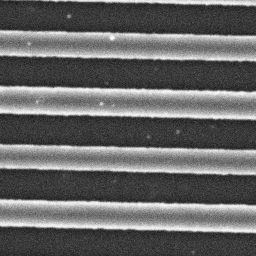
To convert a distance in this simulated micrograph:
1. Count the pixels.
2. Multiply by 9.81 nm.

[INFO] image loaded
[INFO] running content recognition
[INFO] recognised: lines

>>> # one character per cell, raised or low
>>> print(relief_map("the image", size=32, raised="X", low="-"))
-------------------------X-XXXXX
--------------------------------
--------------------------------
--------------------------------
XXXXXXXXXXXXXXXXXXXXXXXXXXXX----
XXXXXXXXXXXXXXXXXXXXXXXXXXXXXXXX
XXXXXXXXXXXXXXXXXXXXXXXXXXXXXXXX
----------------------------X-XX
--------------------------------
--------------------------------
--------------------------------
XXXXXXXXXXXXXXXXXXXXXXXXXXXXXXX-
XXXXXXXXXXXXXXXXXXXXXXXXXXXXXXXX
XXXXXXXXXXXXXXXXXXXXXXXXXXXXXXXX
----------------XXXXXXXXXXXXXXXX
--------------------------------
--------------------------------
--------------------------------
XXXXXXXXXXXXXXX-----------------
XXXXXXXXXXXXXXXXXXXXXXXXXXXXXXXX
XXXXXXXXXXXXXXXXXXXXXXXXXXXXXXXX
--------------------XXXXXXXXXXXX
--------------------------------
--------------------------------
--------------------------------
XXXXXXXXXXXXXXXXXXXXXX----------
XXXXXXXXXXXXXXXXXXXXXXXXXXXXXXXX
XXXXXXXXXXXXXXXXXXXXXXXXXXXXXXXX
-------------XXXXXXXXXXXXXXXXXXX
--------------------------------
--------------------------------
--------------------------------